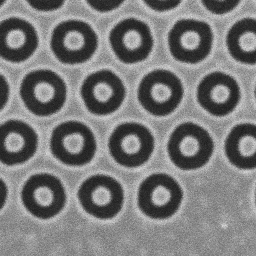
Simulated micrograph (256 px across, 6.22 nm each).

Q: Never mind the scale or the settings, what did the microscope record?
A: a regular array of ring-shaped grooves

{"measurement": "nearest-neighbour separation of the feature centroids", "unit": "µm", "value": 0.359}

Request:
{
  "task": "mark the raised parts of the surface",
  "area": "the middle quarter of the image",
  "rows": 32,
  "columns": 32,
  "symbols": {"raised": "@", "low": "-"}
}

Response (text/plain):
@@@@@@@@@@@@@@@@@@@@@@@@@@@@@@@@
@@@@@@@@@---@@@@@@@@@@@---@@@@@@
@@@@@@@------@@@@@@@@-------@@@@
@@@@@---------@@@@@@---------@@@
@@@@@----------@@@@----------@@@
-@@@----@@@----@@@@---@@@-----@@
-@@@----@@@@---@@@@---@@@@@---@@
-@@@----@@@@---@@@----@@@@@---@@
-@@@@---@@@----@@@----@@@@----@@
@@@@@----------@@@@-----@----@@@
@@@@@---------@@@@@----------@@@
@@@@@@-------@@@@@@@--------@@@@
@@@@@@@-----@@@@@@@@@@-----@@@@@
@@@@@@@@@@@@@@@@@@@@@@@@@@@@@@@@
----@@@@@@@@@@@---@@@@@@@@@@@@--
------@@@@@@@-------@@@@@@@@----
-------@@@@@@--------@@@@@@-----
--@@---@@@@@----------@@@@@-----
@@@@@---@@@----@@@-----@@@----@@
@@@@@---@@@---@@@@@----@@@---@@@
@@@@@---@@@----@@@@----@@@---@@@
-@@@----@@@----@@@@---@@@@---@@@
--------@@@@----------@@@@----@@
-------@@@@@---------@@@@@------
------@@@@@@@--------@@@@@@-----
@@--@@@@@@@@@@-----@@@@@@@@@----
@@@@@@@@@@@@@@@@@@@@@@@@@@@@@@--
@@@@@@@@-@@@@@@@@@@@@@----@@@@@@
@@@@@@------@@@@@@@@@-------@@@@
@@@@@---------@@@@@---------@@@@
@@@@----------@@@@@----------@@@
@@@@----@@@----@@@@----@@@----@@